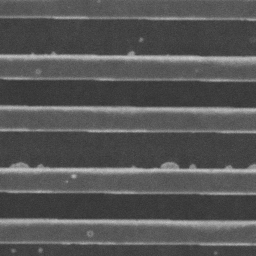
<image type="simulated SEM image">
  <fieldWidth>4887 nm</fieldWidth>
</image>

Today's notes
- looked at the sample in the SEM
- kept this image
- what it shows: lines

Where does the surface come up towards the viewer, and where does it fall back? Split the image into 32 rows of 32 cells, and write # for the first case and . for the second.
################################
################################
...............................#
................................
................................
................................
................................
################################
################################
################################
................................
................................
................................
########################........
################################
################################
...........................#####
................................
................................
................................
................................
################################
################################
################################
................................
................................
................................
#################...............
################################
################################
.........................#######
................................